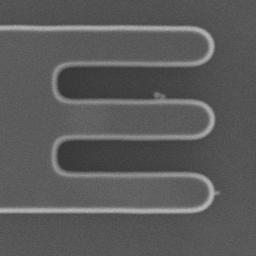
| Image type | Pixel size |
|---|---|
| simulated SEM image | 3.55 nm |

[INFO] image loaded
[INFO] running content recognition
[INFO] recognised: groups of lines, slits or small figures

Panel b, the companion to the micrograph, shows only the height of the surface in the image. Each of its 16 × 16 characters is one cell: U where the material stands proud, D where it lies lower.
DDDDDDDDDDDDDDDD
DDDDDDDDDDDDDDDD
UUUUUUUUUUUUUDDD
UUUUUUUUUUUUUDDD
UUUUDDDDDDDDDDDD
UUUUDDDDDDDDDDDD
UUUUUUUUUUUUUDDD
UUUUUUUUUUUUUDDD
UUUUUUUUUUUUUDDD
UUUDDDDDDDDDDDDD
UUUUDDDDDDDDDDDD
UUUUUUUUUUUUUDDD
UUUUUUUUUUUUUDDD
DDDDDDDDDDDDDDDD
DDDDDDDDDDDDDDDD
DDDDDDDDDDDDDDDD